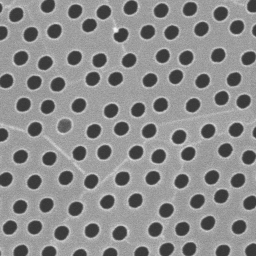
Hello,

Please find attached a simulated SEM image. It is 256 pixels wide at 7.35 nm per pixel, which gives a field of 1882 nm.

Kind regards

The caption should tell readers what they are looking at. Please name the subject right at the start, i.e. a regular array of holes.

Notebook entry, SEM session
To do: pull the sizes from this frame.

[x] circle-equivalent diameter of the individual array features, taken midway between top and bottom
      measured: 108 nm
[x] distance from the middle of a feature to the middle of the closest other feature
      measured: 0.175 microns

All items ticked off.